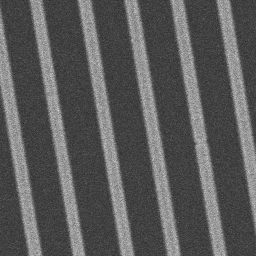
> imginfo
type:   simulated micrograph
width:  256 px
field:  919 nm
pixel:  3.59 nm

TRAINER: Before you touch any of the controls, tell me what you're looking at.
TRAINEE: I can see parallel lines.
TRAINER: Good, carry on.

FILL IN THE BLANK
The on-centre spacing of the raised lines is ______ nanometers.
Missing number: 164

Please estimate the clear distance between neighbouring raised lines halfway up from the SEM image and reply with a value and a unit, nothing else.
0.122 um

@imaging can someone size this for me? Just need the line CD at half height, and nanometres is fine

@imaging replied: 41.6